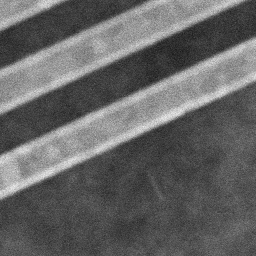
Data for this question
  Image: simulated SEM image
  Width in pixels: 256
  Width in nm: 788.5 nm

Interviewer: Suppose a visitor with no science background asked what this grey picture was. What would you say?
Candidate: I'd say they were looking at one or a few lines or trenches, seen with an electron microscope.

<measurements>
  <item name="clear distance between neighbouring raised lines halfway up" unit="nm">138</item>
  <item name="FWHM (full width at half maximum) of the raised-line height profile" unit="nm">99.2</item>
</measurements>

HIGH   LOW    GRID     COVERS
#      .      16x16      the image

###......#####..
.......#####....
.....#####......
..#####.......##
#####.......####
###.......####..
#.......####....
.....#####......
...#####........
.#####..........
####............
##..............
................
................
................
................